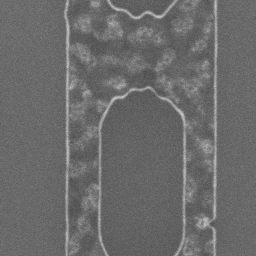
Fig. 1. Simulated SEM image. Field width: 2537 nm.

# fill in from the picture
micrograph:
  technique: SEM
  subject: one or a few lines or trenches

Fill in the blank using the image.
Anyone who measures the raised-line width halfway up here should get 331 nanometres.